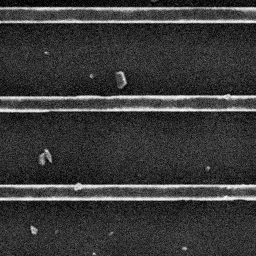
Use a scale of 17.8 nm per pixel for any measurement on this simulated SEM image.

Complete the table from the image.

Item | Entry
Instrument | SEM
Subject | lines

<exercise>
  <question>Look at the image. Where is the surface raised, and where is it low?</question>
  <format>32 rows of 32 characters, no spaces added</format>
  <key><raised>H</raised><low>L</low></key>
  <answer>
LLLLLLLLLLLLLLLLLLLLLLLLLLLLLLLL
HHHHHHHHHHHHHHHHHHHHHHHHHHHHHHHH
HHHHHHHHHHHHHHHHHHHHHHHHHHHHHHHH
LLLLLLLLLLLLLLLLLLLLLLLLLLLLLLLL
LLLLLLLLLLLLLLLLLLLLLLLLLLLLLLLL
LLLLLLLLLLLLLLLLLLLLLLLLLLLLLLLL
LLLLLLLLLLLLLLLLLLLLLLLLLLLLLLLL
LLLLLLLLLLLLLLLLLLLLLLLLLLLLLLLL
LLLLLLLLLLLLLLLLLLLLLLLLLLLLLLLL
LLLLLLLLLLLLLLLLLLLLLLLLLLLLLLLL
LLLLLLLLLLLLLLLLLLLLLLLLLLLLLLLL
LLLLLLLLLLLLLLLLLLLLLLLLLLLLLLLL
HHHHHHHHHHHHHHHHHHHHHHHHHHHHHHHH
HHHHHHHHHHHHHHHHHHHHHHHHHHHHHHHH
LLLLLLLLLLLLLLLLLLLLLLLLLLLLLLLL
LLLLLLLLLLLLLLLLLLLLLLLLLLLLLLLL
LLLLLLLLLLLLLLLLLLLLLLLLLLLLLLLL
LLLLLLLLLLLLLLLLLLLLLLLLLLLLLLLL
LLLLLLLLLLLLLLLLLLLLLLLLLLLLLLLL
LLLLLLLLLLLLLLLLLLLLLLLLLLLLLLLL
LLLLLLLLLLLLLLLLLLLLLLLLLLLLLLLL
LLLLLLLLLLLLLLLLLLLLLLLLLLLLLLLL
LLLLLLLLLLLLLLLLLLLLLLLLLLLLLLLL
HHHHHHHHHHHHHHHHHHHHHHHHHHHHHHHH
HHHHHHHHHHHHHHHHHHHHHHHHHHHHHHHH
LLLLLLLLLLLLLLLLLLLLLLLLLLLLLLLL
LLLLLLLLLLLLLLLLLLLLLLLLLLLLLLLL
LLLLLLLLLLLLLLLLLLLLLLLLLLLLLLLL
LLLLLLLLLLLLLLLLLLLLLLLLLLLLLLLL
LLLLLLLLLLLLLLLLLLLLLLLLLLLLLLLL
LLLLLLLLLLLLLLLLLLLLLLLLLLLLLLLL
LLLLLLLLLLLLLLLLLLLLLLLLLLLLLLLL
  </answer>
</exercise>